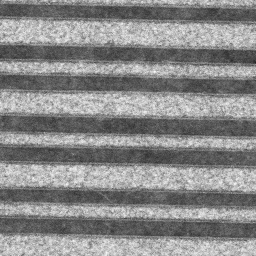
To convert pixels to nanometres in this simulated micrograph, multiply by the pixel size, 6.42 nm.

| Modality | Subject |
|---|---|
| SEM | parallel lines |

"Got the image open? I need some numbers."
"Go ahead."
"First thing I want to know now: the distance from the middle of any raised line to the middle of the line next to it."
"230 nanometres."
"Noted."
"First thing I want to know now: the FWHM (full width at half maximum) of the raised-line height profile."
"98.7 nm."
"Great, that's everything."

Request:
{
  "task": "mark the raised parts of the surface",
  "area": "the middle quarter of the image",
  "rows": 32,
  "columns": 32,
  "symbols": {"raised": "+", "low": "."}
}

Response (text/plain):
................................
................................
................................
++++++++++++++++++++++++......+.
++++++++++++++++++++++++++++++++
++++++++++++++++++++++++++++++++
++++++++++++++++++++++++++++++++
................................
................................
................................
................................
................................
................................
+++++++++++++++++++.............
++++++++++++++++++++++++++++++++
++++++++++++++++++++++++++++++++
++++++++++++++++++++++++++++++++
................++++++++++++++++
................................
................................
................................
++++++++++++++++++++++++++++++++
++++++++++++++++++++++++++++++++
++++++++++++++++++++++++++++++++
++++++++++++++++++++++++++++++++
................................
................................
................................
................................
................................
................................
.....++...........+.............